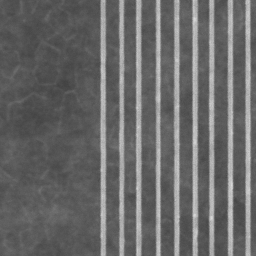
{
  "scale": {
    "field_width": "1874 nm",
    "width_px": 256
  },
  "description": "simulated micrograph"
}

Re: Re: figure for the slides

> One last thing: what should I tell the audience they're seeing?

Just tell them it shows parallel lines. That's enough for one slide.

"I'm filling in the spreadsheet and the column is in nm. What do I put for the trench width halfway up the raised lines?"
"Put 106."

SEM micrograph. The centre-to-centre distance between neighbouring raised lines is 132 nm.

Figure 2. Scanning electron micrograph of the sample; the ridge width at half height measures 26.5 nm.